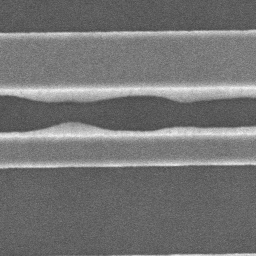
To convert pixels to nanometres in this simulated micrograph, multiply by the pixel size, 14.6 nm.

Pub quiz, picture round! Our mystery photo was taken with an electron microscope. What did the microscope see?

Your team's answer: lines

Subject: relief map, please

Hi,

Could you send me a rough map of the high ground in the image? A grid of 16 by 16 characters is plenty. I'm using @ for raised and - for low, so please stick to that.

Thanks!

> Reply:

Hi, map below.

----------------
----------------
@@@@@@@@@@@@@@@@
@@@@@@@@@@@@@@@@
@@@@@@@@@@@@@@@@
@@@@@@@@@@@@@@@@
----------------
----------------
@@@@@@@@@@@@@@@@
@@@@@@@@@@@@@@@@
----------------
----------------
----------------
----------------
----------------
----------------